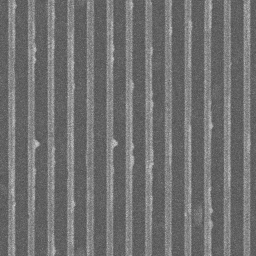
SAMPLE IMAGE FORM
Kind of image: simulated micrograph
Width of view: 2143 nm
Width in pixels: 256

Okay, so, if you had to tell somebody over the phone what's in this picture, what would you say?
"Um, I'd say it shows parallel lines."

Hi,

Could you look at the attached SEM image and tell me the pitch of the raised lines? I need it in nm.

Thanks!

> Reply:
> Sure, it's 164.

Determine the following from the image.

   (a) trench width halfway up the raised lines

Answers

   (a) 14 pixels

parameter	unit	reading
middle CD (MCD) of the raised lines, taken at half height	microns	0.0513